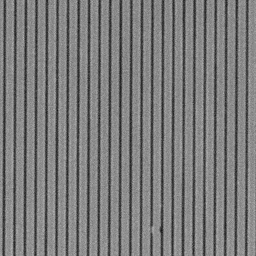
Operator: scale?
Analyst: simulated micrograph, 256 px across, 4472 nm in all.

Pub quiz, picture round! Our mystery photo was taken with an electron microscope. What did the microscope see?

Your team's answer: parallel lines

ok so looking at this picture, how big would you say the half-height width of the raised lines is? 7.13 pixels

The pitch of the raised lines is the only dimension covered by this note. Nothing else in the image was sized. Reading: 184 nanometres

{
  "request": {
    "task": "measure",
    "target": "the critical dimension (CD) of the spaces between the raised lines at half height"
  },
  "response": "59 nanometers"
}